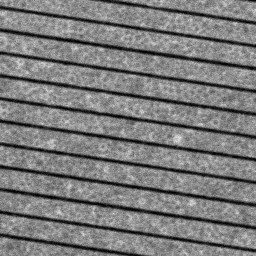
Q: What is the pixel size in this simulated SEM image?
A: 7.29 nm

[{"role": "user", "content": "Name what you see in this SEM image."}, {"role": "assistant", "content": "parallel lines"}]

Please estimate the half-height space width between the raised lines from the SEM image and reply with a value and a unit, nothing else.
33.4 nm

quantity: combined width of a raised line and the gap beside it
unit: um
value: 0.164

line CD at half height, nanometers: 131